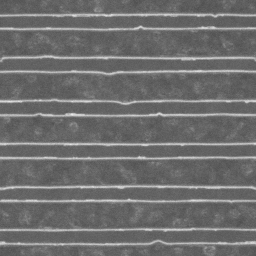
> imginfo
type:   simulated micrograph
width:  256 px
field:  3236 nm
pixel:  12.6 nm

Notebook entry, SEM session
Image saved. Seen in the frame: parallel lines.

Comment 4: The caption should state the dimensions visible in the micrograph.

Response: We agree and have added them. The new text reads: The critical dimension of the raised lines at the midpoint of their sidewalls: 183 nanometres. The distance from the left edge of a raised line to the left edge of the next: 543 nm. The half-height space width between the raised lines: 357 nm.